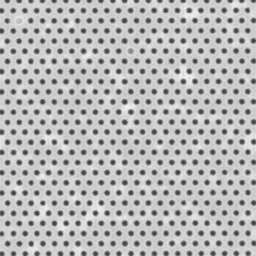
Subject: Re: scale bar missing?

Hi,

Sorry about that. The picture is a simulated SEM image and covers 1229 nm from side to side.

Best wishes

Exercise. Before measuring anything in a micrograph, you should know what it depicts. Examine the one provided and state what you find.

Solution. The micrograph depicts a regular array of holes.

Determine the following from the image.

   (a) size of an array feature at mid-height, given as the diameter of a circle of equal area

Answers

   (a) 5.75 pixels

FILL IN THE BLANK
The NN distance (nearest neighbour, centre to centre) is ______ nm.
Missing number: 54.8